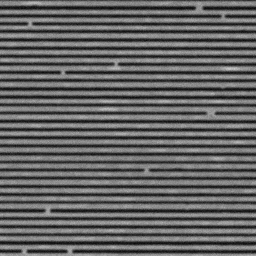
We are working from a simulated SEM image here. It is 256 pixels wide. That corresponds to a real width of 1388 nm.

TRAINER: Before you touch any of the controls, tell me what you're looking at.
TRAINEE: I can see parallel lines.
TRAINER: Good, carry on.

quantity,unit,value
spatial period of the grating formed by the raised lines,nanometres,44.1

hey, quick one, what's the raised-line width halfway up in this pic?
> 27.8 nm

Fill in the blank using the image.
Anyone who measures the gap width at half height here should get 18.3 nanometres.